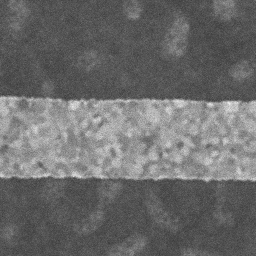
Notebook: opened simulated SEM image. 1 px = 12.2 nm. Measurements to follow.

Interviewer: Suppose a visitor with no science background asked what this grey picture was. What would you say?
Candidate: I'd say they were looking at one or a few lines or trenches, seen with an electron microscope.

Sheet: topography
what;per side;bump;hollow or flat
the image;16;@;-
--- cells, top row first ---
----------------
----------------
----------------
----------------
----------------
----------------
@@@@@@@@@@@@@@@@
@@@@@@@@@@@@@@@@
@@@@@@@@@@@@@@@@
@@@@@@@@@@@@@@@@
@@@@@@@@@@@@@@@@
----------------
----------------
----------------
----------------
----------------